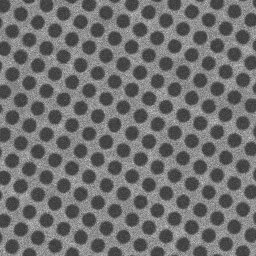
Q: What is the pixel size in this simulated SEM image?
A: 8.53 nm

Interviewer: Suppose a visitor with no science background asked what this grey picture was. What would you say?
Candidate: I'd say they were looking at a regular array of holes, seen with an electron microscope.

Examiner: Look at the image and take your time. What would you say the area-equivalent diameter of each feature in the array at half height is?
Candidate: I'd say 128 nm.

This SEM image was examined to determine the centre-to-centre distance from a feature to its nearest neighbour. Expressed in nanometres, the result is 162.